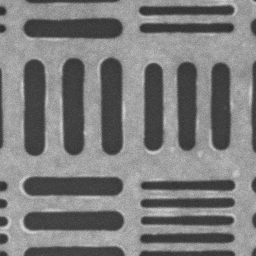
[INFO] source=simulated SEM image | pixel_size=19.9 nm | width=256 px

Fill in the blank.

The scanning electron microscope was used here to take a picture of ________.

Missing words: groups of lines, slits or small figures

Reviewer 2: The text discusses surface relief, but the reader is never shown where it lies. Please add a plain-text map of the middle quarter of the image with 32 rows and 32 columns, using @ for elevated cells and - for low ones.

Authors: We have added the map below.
-----@@@@------@@@@@----@@@@@---
------@@-------@@@@@-----@@@----
-----@@@@------@@@@@-----@@@----
-----@@@@------@@@@@-----@@@----
-----@@@@------@@@@@-----@@@----
-----@@@@------@@@@@-----@@@----
-----@@@@------@@@@@-----@@@----
-----@@@@------@@@@@-----@@@----
-----@@@@------@@@@@-----@@@----
-----@@@@------@@@@@-----@@@----
-----@@@@------@@@@@-----@@@----
-----@@@@------@@@@@-----@@@----
-----@@@@------@@@@@-----@@@----
-----@@@@------@@@@@-----@@@----
-----@@@@------@@@@@-----@@@----
-----@@@@------@@@@@-----@@@----
-----@@@@------@@@@@-----@@@----
-----@@@@------@@@@@-----@@@----
-----@@@@------@@@@@-----@@@----
-----@@@@------@@@@@-----@@@----
-----@@@@------@@@@@-----@@@@---
-----@@@@@-----@@@@@@---@@@@@---
@---@@@@@@----@@@@@@@@@@@@@@@@@@
@@@@@@@@@@@@@@@@@@@@@@@@@@@@@@@@
@@@@@@@@@@@@@@@@@@@@@@@@@@@@@@@@
@@@@@@@@@@@@@@@@@@@@@@@@@@@@@@@@
@@@@@@@@@@@@@@@@@@@@@@@@@@@@@@@@
@@@@@@@@@@@@@@@@@@@@@@@@@@@@@@@@
--------------@@@@@@@@@@@@@@@@@@
---------------@@@@@------------
---------------@@@@-------------
---------------@@@@@------------